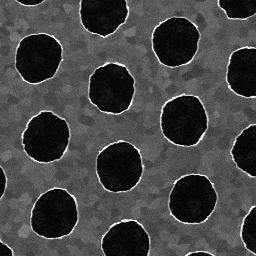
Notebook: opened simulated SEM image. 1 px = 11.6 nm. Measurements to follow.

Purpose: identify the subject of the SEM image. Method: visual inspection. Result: a regular array of holes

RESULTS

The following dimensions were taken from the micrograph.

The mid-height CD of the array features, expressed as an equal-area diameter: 559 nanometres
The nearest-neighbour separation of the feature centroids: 919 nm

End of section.